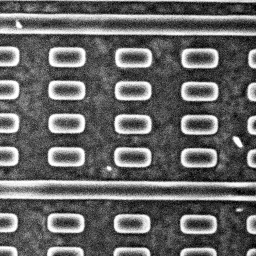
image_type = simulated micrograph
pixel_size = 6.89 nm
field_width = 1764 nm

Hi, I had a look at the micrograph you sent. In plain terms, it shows wiring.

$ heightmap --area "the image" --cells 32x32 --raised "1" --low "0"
00000000000000000000000000000000
00000000000000000000000000000000
11111111111111111111111111111111
11111111111111111111111111111111
00000000000000000000000000000000
00000000000000000000000000000000
11000011111000011110000111100001
11000011111000011110000111100001
00000000000000000000000000000000
00000000000000000000000000000000
11000011110000011110000111100000
11000011111000011110000111100001
00000000000000000000000000000000
00000000000000000000000000000000
11000001110000011100000111100000
11000011111000111110000111100001
11000001110000011100000111100001
00000000000000000000000000000000
11000000000000000000000000000000
11000011110000111110000111100001
11000001110000011110000111100001
00000000000000000000000000000000
00000000000000000000000000000000
11111111111111111111111111111111
11111111111111111111111111111111
00000000000000000000000000000000
00000000000000000000000000000000
11000011110000111110000111100001
11000011110000111110000111100001
00000000000000000000000000000000
00000000000000000000000000000000
11000011110000111110000111100001